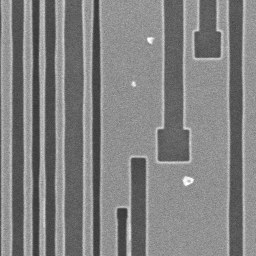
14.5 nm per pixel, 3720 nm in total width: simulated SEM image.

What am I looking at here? groups of lines, slits or small figures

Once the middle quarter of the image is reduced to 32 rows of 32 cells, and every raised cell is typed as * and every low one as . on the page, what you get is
.....**..****************.....**
.....**..****************.....**
.....**..****************.....**
.....**..****************.....**
.....**..****************.....**
.....**..****************.....**
.....**..****************.....**
.....**..****************.....**
.....**..****************.....**
.....**..****************.....**
.....**..****************.....**
.....**..****************.....**
.....**..****************.....**
.....**..****************.....**
.....**..****************.....**
.....**..****************.....**
.....**..**************........*
.....**..**************.........
.....**..**************.........
.....**..**************.........
.....**..**************.........
.....**..**************.........
.....**..**************.........
.....**..********...***.........
.....**..********....***.......*
.....**..********....***********
.....**..********....***********
.....**..********....***********
.....**..********....***********
.....**..********....***********
.....**..********....***********
.....**..********....***********